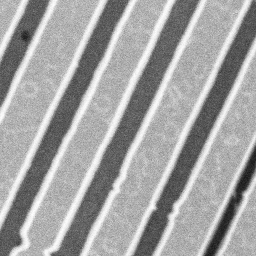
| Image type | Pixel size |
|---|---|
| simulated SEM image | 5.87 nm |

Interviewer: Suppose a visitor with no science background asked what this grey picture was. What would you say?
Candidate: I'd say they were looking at one or a few lines or trenches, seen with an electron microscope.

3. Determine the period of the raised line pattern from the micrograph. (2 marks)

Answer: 388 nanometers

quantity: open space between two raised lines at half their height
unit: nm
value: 139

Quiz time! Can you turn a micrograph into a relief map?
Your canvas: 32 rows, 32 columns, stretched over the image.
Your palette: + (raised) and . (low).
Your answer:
+++...+++++++...+++++....++++++.
+++...++++++....+++++....++++++.
++....++++++...+++++....++++++..
++...++++++....+++++....++++++..
+....++++++...+++++....++++++...
+...+++++++...+++++....++++++...
....++++++...++++++...++++++...+
...+++++++...+++++....++++++...+
...++++++....+++++...++++++...++
..+++++++...+++++....++++++...++
..++++++....+++++...++++++....++
.+++++++...+++++....++++++...+++
.++++++....+++++....+++++....+++
+++++++...+++++....++++++...++++
++++++....+++++....+++++....++++
++++++...++++++...++++++...+++++
+++++....+++++....+++++....+++++
+++++...+++++....++++++...++++++
++++....+++++....+++++....++++++
++++...++++++...++++++...++++++.
+++....+++++....++++++...++++++.
+++...++++++...++++++...++++++..
+++...+++++....++++++...++++++..
++...++++++...++++++...++++++..+
++...+++++....++++++...++++++.++
+...++++++...++++++...++++++..++
+...+++++....++++++...++++++..++
...++++++...++++++...++++++..+++
...+++++....++++++...++++++..+++
...+++++...++++++....+++++..++++
...++++....++++++...++++++..++++
..++++.....+++++....+++++..+++++